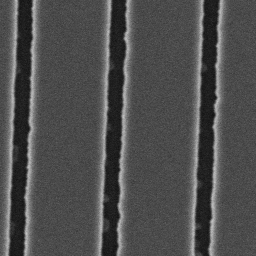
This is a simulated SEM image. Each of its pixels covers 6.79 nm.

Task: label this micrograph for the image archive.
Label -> lines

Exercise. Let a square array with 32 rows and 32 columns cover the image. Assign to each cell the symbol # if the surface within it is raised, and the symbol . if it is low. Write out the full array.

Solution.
##..##########..#########..#####
##..##########..#########..#####
##..##########..#########..#####
##..##########..#########..#####
##..##########..#########..#####
##..##########..#########..#####
##..##########..#########..#####
##..##########..#########..#####
##..##########.##########..#####
##..#########...#########..#####
##..#########..##########..#####
##..#########..##########..#####
##..#########..##########..#####
##..#########..##########..#####
##..#########..##########..#####
##..#########..##########..#####
##..#########..##########..#####
##..#########..##########..#####
##..#########..##########..#####
#..##########..##########..#####
#..##########..##########..#####
#..##########..##########..#####
#..##########..##########..#####
#..##########..##########..#####
#..##########..#########..######
#..##########..#########..######
#..##########..#########...#####
#..##########..#########..######
#..##########..#########..######
#..##########..#########..######
#..##########..#########..######
#..##########..#########..######